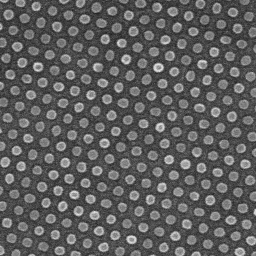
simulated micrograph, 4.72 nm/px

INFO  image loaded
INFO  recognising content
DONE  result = a regular array of raised bodies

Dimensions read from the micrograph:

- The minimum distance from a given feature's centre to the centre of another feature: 76.8 nanometers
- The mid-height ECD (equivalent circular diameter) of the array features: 42.3 nm